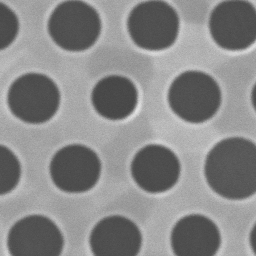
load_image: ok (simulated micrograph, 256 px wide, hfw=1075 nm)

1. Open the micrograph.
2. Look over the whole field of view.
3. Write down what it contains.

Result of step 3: holes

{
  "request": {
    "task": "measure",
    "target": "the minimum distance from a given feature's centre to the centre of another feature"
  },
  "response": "337 nm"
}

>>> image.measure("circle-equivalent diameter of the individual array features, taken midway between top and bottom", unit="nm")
217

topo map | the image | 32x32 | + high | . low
.++++++....++++++....++++++.....
..++++......++++......++++......
..++++.......+++......++++......
..++++.......+++......++++......
..++++......++++......++++......
.++++++.....+++++.....+++++.....
+++++++++.++++++++++++++++++++++
++++++++++++++++++++++++++++++++
++++++++++++++++++++++++++++++++
++....++++++++.+++++++....++++++
+......+++++.....++++......+++++
+.......+++......++++.......+++.
+.......+++......++++.......+++.
+......+++++.....++++......+++++
++.....++++++...++++++.....+++++
++++.+++++++++++++++++++++++++++
++++++++++++++++++++++++++++++++
++++++++++++++++++++++++++++...+
.+++++++...+++++++...+++++......
..+++++.....+++++.....++++......
...+++.......+++.......+++......
...+++.......+++.......+++......
..++++......+++++.....++++......
..+++++.....++++++...+++++......
++++++++++++++++++++++++++++....
++++++++++++++++++++++++++++++++
++++++++++++++++++++++++++++++++
++.....++++++...++++++....++++++
+......+++++.....+++++.....+++++
+.......+++.......+++.......+++.
+.......+++.......+++.......+++.
+.......+++......+++++.....+++++